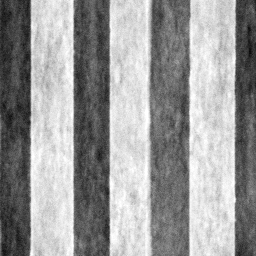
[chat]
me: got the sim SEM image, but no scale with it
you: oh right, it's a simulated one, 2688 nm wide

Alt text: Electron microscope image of lines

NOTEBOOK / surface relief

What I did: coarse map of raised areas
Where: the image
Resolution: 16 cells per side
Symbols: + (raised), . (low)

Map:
..+++..++...+++.
..+++..++...+++.
..+++..++...+++.
..+++..++...+++.
..+++..++...+++.
..+++..++...+++.
..+++..++...+++.
..+++..++...+++.
..+++..++...+++.
..+++..++...+++.
..+++..++...+++.
..+++..++...+++.
..+++..++...+++.
..+++..++...+++.
..+++..++...+++.
..+++..++...+++.